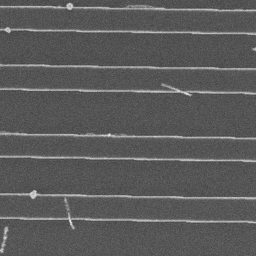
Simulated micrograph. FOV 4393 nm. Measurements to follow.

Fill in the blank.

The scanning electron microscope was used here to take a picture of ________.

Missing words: lines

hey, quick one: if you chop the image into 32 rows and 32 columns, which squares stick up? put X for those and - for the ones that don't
--------------------------------
XXXXXXXXXXXXXXXXXXXXXXXXXXXXXXXX
XXXXXXXXXXXXXXXXXXXXXXXXXXXXXXXX
XXXXXXXXXXXXXXXXXXXXXXXXXXXXXXXX
--------------------------------
--------------------------------
--------------------------------
--------------------------------
XXXXXXXXXXXXXXXXXXXX------------
XXXXXXXXXXXXXXXXXXXXXXXXXXXXXXXX
XXXXXXXXXXXXXXXXXXXXXXXXXXXXXXXX
----------------------XX-XXXXXXX
--------------------------------
--------------------------------
--------------------------------
--------------------------------
--------------------------------
XXXXXXXXXXXXXXXXXXXXXXXXXXXXXXXX
XXXXXXXXXXXXXXXXXXXXXXXXXXXXXXXX
XXXXXXXXXXXXXXXXXXXXXXXXXXXXXXXX
--------------------------------
--------------------------------
--------------------------------
--------------------------------
XXXXXXXXXXX---------------------
XXXXXXXXXXXXXXXXXXXXXXXXXXXXXXXX
XXXXXXXXXXXXXXXXXXXXXXXXXXXXXXXX
----------------XXXXXXXXXXXXXXXX
--------------------------------
--------------------------------
--------------------------------
--------------------------------